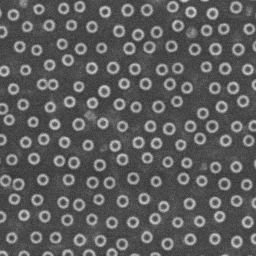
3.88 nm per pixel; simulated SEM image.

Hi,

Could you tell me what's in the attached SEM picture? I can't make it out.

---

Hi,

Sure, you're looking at a regular array of raised bodies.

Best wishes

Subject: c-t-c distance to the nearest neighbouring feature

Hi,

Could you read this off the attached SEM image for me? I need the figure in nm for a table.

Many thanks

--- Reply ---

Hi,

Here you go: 70.8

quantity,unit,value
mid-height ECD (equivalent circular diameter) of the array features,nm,38.4